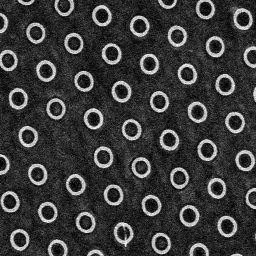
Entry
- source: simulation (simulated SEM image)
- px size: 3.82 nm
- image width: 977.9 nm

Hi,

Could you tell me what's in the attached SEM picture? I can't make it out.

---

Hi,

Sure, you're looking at a regular array of ring-shaped raised bodies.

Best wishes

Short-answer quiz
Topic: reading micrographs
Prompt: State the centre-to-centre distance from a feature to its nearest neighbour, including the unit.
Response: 148 nanometres